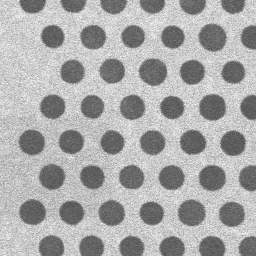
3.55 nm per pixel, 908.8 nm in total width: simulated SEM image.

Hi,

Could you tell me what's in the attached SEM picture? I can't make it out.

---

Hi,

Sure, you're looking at a regular array of holes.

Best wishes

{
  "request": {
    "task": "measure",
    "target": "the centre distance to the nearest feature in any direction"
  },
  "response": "141 nm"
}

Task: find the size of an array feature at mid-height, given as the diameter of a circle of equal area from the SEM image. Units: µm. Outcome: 0.0893